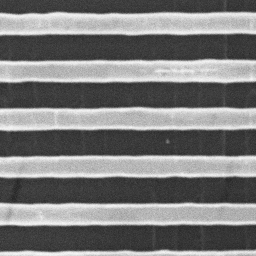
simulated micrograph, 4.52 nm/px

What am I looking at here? wiring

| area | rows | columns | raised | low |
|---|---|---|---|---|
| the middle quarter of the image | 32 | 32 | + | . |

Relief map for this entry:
++++++++++++++++++++++++++++++++
++++++++++++++++++++++++++++++++
++++++++++++++++++++++++++++++++
++++++++++++++++++++++++++++++++
................................
................................
................................
................................
................................
................................
................................
++++++++++++++++++++++++++++++++
++++++++++++++++++++++++++++++++
++++++++++++++++++++++++++++++++
++++++++++++++++++++++++++++++++
++++++++++++++++++++++++++++++++
................................
................................
................................
................................
................................
................................
................................
++++++++++++++++++++++++++++++++
++++++++++++++++++++++++++++++++
++++++++++++++++++++++++++++++++
++++++++++++++++++++++++++++++++
++++++++++++++++++++++++++++++++
................................
................................
................................
................................